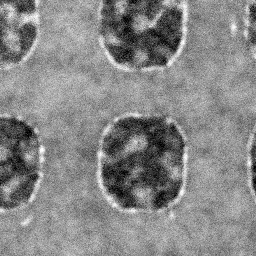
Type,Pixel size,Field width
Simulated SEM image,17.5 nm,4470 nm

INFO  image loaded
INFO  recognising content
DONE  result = raised bodies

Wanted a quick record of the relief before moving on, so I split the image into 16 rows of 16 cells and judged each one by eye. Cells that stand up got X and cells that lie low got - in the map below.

XX----XXXXXX---X
XX----XXXXXX---X
XX----XXXXX----X
XX-----XXXX-----
----------------
----------------
----------------
X------XXXX-----
XX----XXXXX-----
XXX---XXXXXX----
XXX---XXXXXX----
XX----XXXXX-----
XX-----XXXX-----
----------------
----------------
----------------